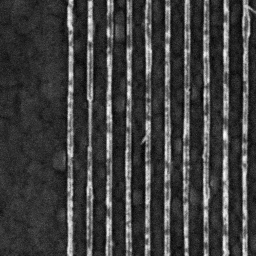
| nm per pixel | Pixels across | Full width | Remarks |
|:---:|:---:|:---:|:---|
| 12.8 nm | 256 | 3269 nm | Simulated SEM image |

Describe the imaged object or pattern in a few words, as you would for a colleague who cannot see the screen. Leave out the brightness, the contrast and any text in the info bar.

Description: parallel lines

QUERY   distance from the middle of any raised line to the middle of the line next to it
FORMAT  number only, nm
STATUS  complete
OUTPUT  248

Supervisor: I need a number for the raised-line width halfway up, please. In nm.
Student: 59.1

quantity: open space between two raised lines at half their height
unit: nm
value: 188